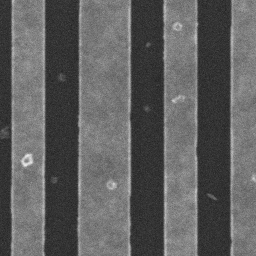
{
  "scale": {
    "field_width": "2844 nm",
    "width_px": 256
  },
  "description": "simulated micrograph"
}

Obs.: lines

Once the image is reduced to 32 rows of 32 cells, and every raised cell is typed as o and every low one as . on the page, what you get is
..oooo....oooooo....ooooo....ooo
..oooo....oooooo....ooooo....ooo
..oooo....oooooo....ooooo....ooo
..oooo....oooooo.....oooo....ooo
..oooo....oooooo....ooooo....ooo
..oooo....oooooo.....oooo....ooo
..oooo....oooooo....ooooo....ooo
..oooo....oooooo....ooooo....ooo
..oooo....oooooo.....oooo....ooo
..oooo....oooooo.....oooo....ooo
..oooo....oooooo.....oooo....ooo
..oooo....oooooo.....oooo....ooo
..oooo....oooooo.....oooo....ooo
..oooo....oooooo.....oooo....ooo
..oooo....oooooo.....oooo....ooo
..oooo....oooooo.....oooo....ooo
..oooo....oooooo.....oooo....ooo
..oooo....oooooo.....oooo....ooo
..oooo....oooooo.....oooo....ooo
..oooo....oooooo.....oooo....ooo
..oooo....oooooo.....oooo....ooo
..oooo....oooooo.....oooo....ooo
..oooo....oooooo.....oooo....ooo
.ooooo....oooooo.....oooo....ooo
.ooooo....oooooo.....oooo....ooo
.ooooo....oooooo.....oooo....ooo
.ooooo....oooooo.....oooo....ooo
..oooo....oooooo.....oooo....ooo
..oooo....oooooo.....oooo....ooo
..oooo....oooooo.....oooo....ooo
.ooooo....oooooo.....oooo....ooo
.ooooo....oooooo.....oooo....ooo